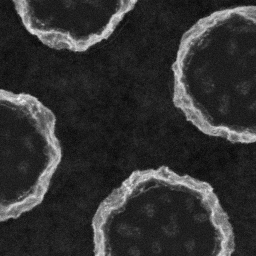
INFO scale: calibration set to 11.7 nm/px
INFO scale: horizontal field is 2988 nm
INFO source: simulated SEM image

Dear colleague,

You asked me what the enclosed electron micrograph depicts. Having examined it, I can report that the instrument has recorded raised bodies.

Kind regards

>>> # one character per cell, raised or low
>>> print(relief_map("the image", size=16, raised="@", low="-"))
-@@@@@@@--------
--@@@@@------@@@
----@@------@@@@
-----------@@@@@
-----------@@@@@
-----------@@@@@
@@----------@@@@
@@@---------@@@@
@@@------------@
@@@-------------
@@@-------------
@@@-----@@@@----
@@-----@@@@@@---
------@@@@@@@@--
------@@@@@@@@--
------@@@@@@@@--